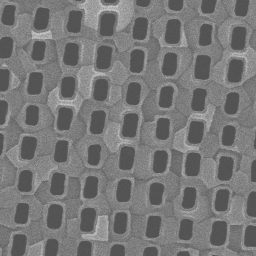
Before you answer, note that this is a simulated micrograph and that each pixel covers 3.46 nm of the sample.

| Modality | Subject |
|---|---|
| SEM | a regular array of holes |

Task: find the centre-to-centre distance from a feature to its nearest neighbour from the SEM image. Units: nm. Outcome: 112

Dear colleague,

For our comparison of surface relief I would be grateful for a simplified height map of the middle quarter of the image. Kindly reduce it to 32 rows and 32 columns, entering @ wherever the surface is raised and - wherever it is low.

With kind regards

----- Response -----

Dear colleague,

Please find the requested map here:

@@-@@@@@---@@@@@----@@@@@---@@@@
@@@@@@@@@@@@@@@@@---@@@@----@@@@
@@@@@@@@@@@@@@@@@@@@@@@@@---@@@@
---@@@@@@@@@@@@@@@@@@@@@@@@@@@@@
---@@@@@---@@@@@@-@@@@@@@@@@@@@@
---@@@@@---@@@@@---@@@@@@@@@@@@@
---@@@@@---@@@@@---@@@@@---@@@@@
--@@@@@----@@@@@---@@@@@---@@@@@
@@@@@@@----@@@@----@@@@@---@@@@@
@@@@@@@@@@@@@@@@---@@@@@---@@@@@
@@@@@@@@@@@@@@@@@@@@@@@@---@@@@@
--@@@@@@@@@@@@@@@@@@@@@@@@@@@@@@
--@@@@@---@@@@@@--@@@@@@@@@@@@@@
--@@@@@---@@@@@----@@@@@-@@@@@@@
--@@@@@---@@@@@----@@@@---@@@@@@
--@@@@@---@@@@@---@@@@@---@@@@@-
-@@@@@----@@@@----@@@@@---@@@@@-
@@@@@@@--@@@@@----@@@@@---@@@@@-
@@@@@@@@@@@@@@@@@@@@@@@---@@@@@-
-@@@@@@@@@@@@@@@@@@@@@@@@@@@@@@-
-@@@@@---@@@@@@-@@@@@@@@@@@@@@@@
-@@@@@---@@@@@----@@@@@@@@@@@@@@
-@@@@@---@@@@@----@@@@@---@@@@@-
-@@@@@---@@@@@----@@@@----@@@@@-
@@@@@@---@@@@@----@@@@----@@@@--
@@@@@@@@@@@@@@---@@@@@----@@@@--
@@@@@@@@@@@@@@@-@@@@@@---@@@@@--
@@@@@@@@@@@@@@@@@@@@@@@@@@@@@@--
@@@@@@---@@@@@@@@@@@@@@@@@@@@@@@
@@@@@----@@@@----@@@@@@@@@@@@@@@
@@@@@----@@@@----@@@@----@@@@@@@
@@@@@---@@@@@----@@@@----@@@@@--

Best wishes